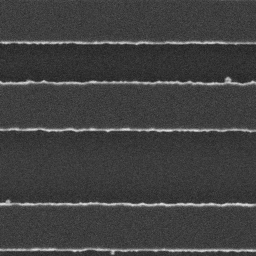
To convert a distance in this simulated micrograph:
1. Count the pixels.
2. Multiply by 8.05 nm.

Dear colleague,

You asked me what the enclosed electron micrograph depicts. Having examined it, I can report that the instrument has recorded lines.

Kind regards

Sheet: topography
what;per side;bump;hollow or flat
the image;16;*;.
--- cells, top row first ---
****************
****************
****************
................
................
****************
****************
****************
................
................
................
................
................
****************
****************
****************